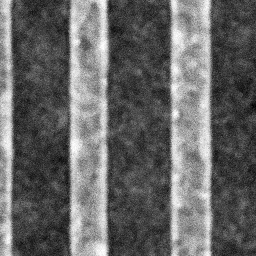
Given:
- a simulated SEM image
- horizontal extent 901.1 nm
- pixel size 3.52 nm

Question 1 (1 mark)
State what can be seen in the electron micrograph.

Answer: one or a few lines or trenches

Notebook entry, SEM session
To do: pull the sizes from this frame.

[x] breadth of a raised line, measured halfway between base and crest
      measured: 0.116 microns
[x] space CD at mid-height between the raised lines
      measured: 234 nm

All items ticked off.